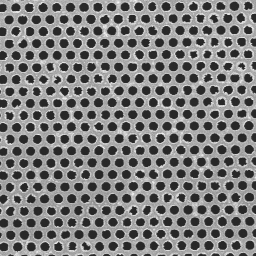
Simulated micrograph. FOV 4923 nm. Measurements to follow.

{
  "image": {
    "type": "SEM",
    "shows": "a regular array of holes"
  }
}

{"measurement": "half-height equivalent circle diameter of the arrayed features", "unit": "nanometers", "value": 175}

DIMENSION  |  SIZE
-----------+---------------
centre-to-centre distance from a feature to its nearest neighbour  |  0.255 microns